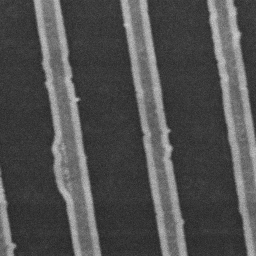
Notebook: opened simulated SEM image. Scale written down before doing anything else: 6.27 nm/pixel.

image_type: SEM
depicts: one or a few lines or trenches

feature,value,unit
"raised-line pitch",539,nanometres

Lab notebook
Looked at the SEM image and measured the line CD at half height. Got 0.123 microns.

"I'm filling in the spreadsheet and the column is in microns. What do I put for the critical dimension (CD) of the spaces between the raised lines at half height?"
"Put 0.414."